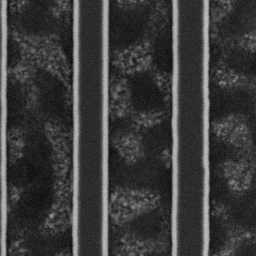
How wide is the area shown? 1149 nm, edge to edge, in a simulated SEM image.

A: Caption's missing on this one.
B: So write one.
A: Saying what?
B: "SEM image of one or a few lines or trenches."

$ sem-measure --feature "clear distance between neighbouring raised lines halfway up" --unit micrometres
0.309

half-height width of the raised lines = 143 nanometers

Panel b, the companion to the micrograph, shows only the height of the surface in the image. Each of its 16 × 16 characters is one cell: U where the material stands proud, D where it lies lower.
DDDDDUUDDDDUUDDD
DDDDDUUDDDDUUDDD
DDDDDUUDDDDUUDDD
DDDDDUUDDDDUUDDD
DDDDDUUDDDDUUDDD
DDDDDUUDDDDUUDDD
DDDDDUUDDDDUUDDD
DDDDDUUDDDDUUDDD
DDDDDUUDDDDUUDDD
DDDDDUUDDDDUUDDD
DDDDDUUDDDDUUDDD
DDDDDUUDDDDUUDDD
DDDDDUUDDDDUUDDD
DDDDDUUDDDDUUDDD
DDDDDUUDDDDUUDDD
DDDDDUUDDDDUUDDD